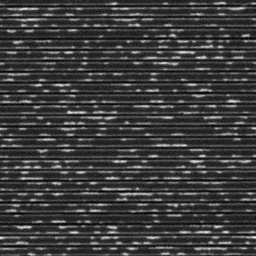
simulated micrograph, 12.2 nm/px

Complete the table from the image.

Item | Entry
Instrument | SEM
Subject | parallel lines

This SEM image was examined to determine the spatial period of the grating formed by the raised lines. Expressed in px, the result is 10.9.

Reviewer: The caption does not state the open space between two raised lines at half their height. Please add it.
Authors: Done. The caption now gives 38.1 nanometers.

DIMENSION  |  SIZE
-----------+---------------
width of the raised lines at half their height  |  92.9 nm